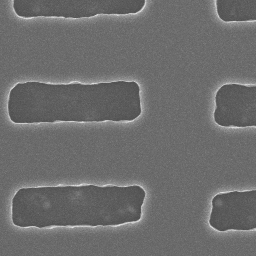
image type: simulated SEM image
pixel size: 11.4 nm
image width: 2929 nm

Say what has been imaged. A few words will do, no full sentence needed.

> holes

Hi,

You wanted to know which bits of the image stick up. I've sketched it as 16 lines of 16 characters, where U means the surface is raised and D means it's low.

UDDDDDDDDUUUUUDD
UUUUUUUUUUUUUUUU
UUUUUUUUUUUUUUUU
UUUUUUUUUUUUUUUU
UUUUUUUUUUUUUUUU
UDDDDDDDDUUUUUDD
UDDDDDDDDUUUUDDD
UDDDDDDDUUUUUUDD
UUUUUUUUUUUUUUUU
UUUUUUUUUUUUUUUU
UUUUUUUUUUUUUUUU
UUUUUUUUUUUUUUUU
UDDDDDDDDUUUUDDD
UDDDDDDDDUUUUDDD
UUUUUUUUUUUUUUUU
UUUUUUUUUUUUUUUU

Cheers